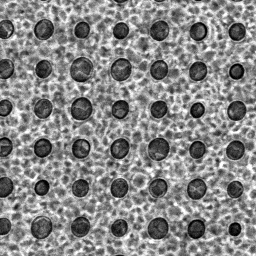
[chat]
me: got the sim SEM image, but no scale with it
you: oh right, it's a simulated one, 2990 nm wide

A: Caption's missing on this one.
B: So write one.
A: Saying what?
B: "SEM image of a regular array of holes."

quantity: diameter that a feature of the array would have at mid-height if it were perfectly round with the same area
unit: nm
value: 229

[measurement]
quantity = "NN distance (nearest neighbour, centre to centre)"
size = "449 nanometres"